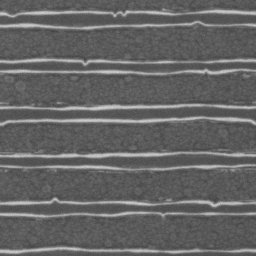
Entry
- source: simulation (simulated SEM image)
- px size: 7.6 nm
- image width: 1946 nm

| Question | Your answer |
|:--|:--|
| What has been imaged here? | parallel lines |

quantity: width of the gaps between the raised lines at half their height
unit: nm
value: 264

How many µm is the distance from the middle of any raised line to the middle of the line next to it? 0.36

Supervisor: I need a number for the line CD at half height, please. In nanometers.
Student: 95